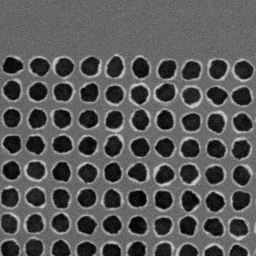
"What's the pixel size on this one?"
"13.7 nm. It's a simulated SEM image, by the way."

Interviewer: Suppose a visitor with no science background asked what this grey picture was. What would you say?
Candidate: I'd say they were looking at a regular array of holes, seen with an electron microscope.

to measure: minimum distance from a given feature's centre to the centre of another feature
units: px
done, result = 24.8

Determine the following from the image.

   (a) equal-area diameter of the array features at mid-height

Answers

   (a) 264 nm